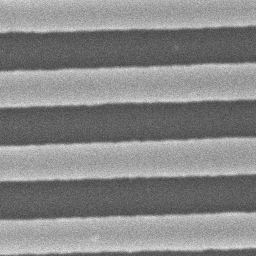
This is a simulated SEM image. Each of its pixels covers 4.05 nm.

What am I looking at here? lines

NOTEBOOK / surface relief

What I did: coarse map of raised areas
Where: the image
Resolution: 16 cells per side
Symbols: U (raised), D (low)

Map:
UUUUUUUUUUUUUUUU
UUUUUUUUUUUUUUUU
DDDDDDDDDDDDDDDD
DDDDDDDDDDDDDDDD
UUUUUUUUUUUUUUUU
UUUUUUUUUUUUUUUU
UUUUUUDDDDDDDDDD
DDDDDDDDDDDDDDDD
DDDDDDDDDDDDDDDD
UUUUUUUUUUUUUUUU
UUUUUUUUUUUUUUUU
DDDDDDDDDDDDDDDD
DDDDDDDDDDDDDDDD
DDDDDDDDDDUUUUUU
UUUUUUUUUUUUUUUU
UUUUUUUUUUUUUUUU